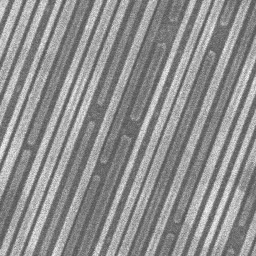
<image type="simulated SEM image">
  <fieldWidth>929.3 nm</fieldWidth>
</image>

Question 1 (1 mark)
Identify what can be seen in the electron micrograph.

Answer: parallel lines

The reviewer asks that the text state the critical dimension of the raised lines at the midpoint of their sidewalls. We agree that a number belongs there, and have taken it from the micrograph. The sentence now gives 27.1 nm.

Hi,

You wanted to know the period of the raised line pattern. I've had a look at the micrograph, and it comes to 0.0456 µm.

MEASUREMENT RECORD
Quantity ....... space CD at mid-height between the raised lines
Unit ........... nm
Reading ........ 19.9